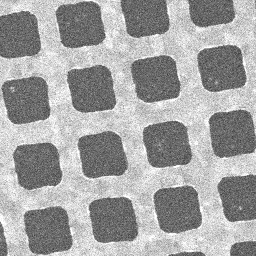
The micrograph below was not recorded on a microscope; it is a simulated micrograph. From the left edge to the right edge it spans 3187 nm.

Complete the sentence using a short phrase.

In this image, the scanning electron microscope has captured a regular array of holes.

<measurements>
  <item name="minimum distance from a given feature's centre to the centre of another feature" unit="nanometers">817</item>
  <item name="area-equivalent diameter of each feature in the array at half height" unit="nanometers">624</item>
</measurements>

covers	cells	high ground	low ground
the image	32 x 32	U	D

UUUUUUUUDDDDUUUDDDDDDUUUDDDDDUUU
UUDDUUUDDDDDDUUDDDDDDUUUDDDDDUUU
DDDDDUUDDDDDDUUUDDDDDUUUDDDDDUUU
DDDDDUUDDDDDDUUUDDDDDUUUUUUUUUUU
DDDDDUUDDDDDDUUUDDDUUUUUUUUUUUUU
DDDDDUUUDDDDUUUUUUUUUUUUUUUUUUUU
DDDDDUUUUUUUUUUUUUUUUUUUUDDDDDUU
UUUUUUUUUUUUUUUUUDDDDDUUUDDDDDUU
UUUUUUUUUDUDDUUUDDDDDDUUUDDDDDDU
UUUUUUUUDDDDDDUUDDDDDDUUUDDDDDDU
DDDDDDUUDDDDDDUUUDDDDDDUUDDDDDDU
DDDDDDUUUDDDDDUUUDDDDDDUUUDUUUUU
DDDDDDUUUDDDDDDUUUDDDUUUUUUUUUUU
UDDDDDUUUDDDDDUUUUUUUUUUUUUUUUUU
UDDDDDUUUUUUUUUUUUUUUUUUUUDDDDDU
UUDUUUUUUUUUUUUUUUUDDDDUUUDDDDDD
UUUUUUUUUUUUUDUUUUDDDDDUUUDDDDDD
UUUUUUUUUUDDDDDUUUDDDDDDUUDDDDDD
UUDDDDDUUUDDDDDDUUDDDDDDUUDDDDDD
UUDDDDDUUUDDDDDDUUDDDDDDUUUDDDUU
UUDDDDDDUUDDDDDDUUUDDDDUUUUUUUUU
UUDDDDDDUUDDDDDDUUUUUUUUUUUUUUUU
UUDDDDDDUUUUUUUUUUUUUUUUUUUUDDDD
UUUDDUUUUUUUUUUUUUUUDDDDUUUDDDDD
UUUUUUUUUUUUUUUUUUUDDDDDDUUDDDDD
UUUUUUUUUUUDDDDDDUUDDDDDDUUUDDDD
UUUDDDDDUUUDDDDDDUUDDDDDDUUUDDDD
UUUDDDDDDUUDDDDDDUUUDDDDDUUUDDDD
UUUDDDDDDUUDDDDDDUUUDDDDDUUUUUUU
DUUDDDDDDUUUDDDDDUUUUUUUUUUUUUUU
DUUUDDDDDUUUUUUUUUUUUUUUUUUUUDDD
DUUUDDDDUUUUUUUUUUUUUUUDDUUUUDDD